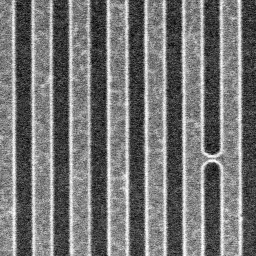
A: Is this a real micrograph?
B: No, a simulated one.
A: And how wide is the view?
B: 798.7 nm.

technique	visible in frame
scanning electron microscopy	parallel lines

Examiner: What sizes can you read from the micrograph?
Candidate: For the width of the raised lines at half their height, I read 59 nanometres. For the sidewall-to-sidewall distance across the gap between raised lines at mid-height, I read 59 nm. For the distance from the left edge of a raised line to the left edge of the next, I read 118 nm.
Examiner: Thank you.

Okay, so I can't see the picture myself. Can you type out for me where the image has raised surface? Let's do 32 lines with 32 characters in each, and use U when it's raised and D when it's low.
UUDDUUDDDUUDDDUUDDUUDDDUUDDDUUDD
UUDDUUDDDUUDDDUUDDUUDDDUUDDDUUDD
UUDDUUDDDUUDDDUUDDUUDDDUUDDDUUDD
UUDDUUDDDUUDDDUUDDUUDDDUUDDDUUDD
UUDDUUDDDUUDDDUUDDUUDDDUUDDDUUDD
UUDDUUDDDUUDDDUUDDUUDDDUUDDDUUDD
UUDDUUDDDUUDDDUUDDUUDDDUUDDDUUDD
UUDDUUDDDUUDDDUUDDUUUDDUUDDDUUDD
UUDDUUDDDUUDDDUUDDUUUDDUUDDDUUDD
UUDDUUDDDUUDDDUUDDUUUDDUUDDDUUDD
UUDDUUDDDUUDDDUUDDUUUDDUUDDDUUDD
UUDDUUDDDUUDDDUUDDUUUDDUUDDDUUDD
UUDDUUDDDUUDDDUUDDUUUDDUUDDDUUDD
UUDDUUDDDUUDDDUUDDUUUDDUUDDDUUDD
UUDDUUDDDUUDDDUUDDUUUDDUUDDDUUDD
UUDDUUDDDUUDDDUUDDUUUDDUUDDDUUDD
UUDDUUDDDUUDDDUUDDUUUDDUUDDDUUDD
UUDDUUDDDUUDDDUUDDUUUDDUUDDDUUDD
UUDDUUDDDUUDDDUUDDUUUDDUUDDDUUDD
UUDDUUDDDUUDDDUUDDUUUDDUUUUUUUDD
UUDDUUDDDUUDDDUUDDUUUDDUUUDUUUDD
UUDDUUDDDUUDDDUUDDUUUDDUUDDDUUDD
UUDDUUDDDUUDDDUUDDUUUDDUUDDDUUDD
UUDDUUDDDUUDDDUUDDUUUDDUUDDDUUDD
UUDDUUDDDUUDDDUUDDUUUDDUUDDDUUDD
UUDDUUDDDUUDDDUUDDUUUDDUUDDDUUDD
UUDDUUDDDUUDDDUUDDUUUDDUUDDDUUDD
UUDDUUDDDUUDDDUUDDUUUDDUUDDDUUDD
UUDDUUDDDUUDDDUUDDUUUDDUUDDDUUDD
UUDDUUDDDUUDDDUUDDUUUDDUUDDDUUDD
UUDDUUDDDUUDDDUUDDUUUDDUUDDDUUDD
UUDDUUDDDUUDDDUUDDUUUDDUUDDDUUDD